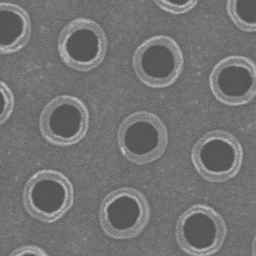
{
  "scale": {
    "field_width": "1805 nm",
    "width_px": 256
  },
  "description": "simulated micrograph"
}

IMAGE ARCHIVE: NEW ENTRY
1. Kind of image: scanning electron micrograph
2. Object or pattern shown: ring-shaped raised bodies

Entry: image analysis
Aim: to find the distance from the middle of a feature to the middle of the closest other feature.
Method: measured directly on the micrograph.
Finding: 540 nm